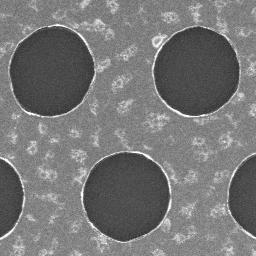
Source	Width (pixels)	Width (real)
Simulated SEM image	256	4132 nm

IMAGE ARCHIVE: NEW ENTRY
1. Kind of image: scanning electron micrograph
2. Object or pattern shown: holes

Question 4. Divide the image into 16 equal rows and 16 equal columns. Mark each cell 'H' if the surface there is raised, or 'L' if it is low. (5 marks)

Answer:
HHHHHHHHHHHHHHHH
HHHHHHHHHHHHHHHH
HLLLLHHHHHHLLLHH
HLLLLLHHHHLLLLLH
HLLLLLHHHHLLLLLH
HLLLLLHHHHLLLLLH
HLLLLHHHHHLLLLHH
HHHHHHHHHHHHHHHH
HHHHHHHHHHHHHHHH
HHHHHHHHHHHHHHHH
LHHHHHLLLLHHHHHL
LHHHHLLLLLLHHHLL
LHHHHLLLLLLHHHLL
LHHHHLLLLLHHHHHL
LHHHHHLLLHHHHHHL
HHHHHHHHHHHHHHHH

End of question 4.